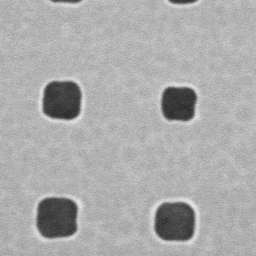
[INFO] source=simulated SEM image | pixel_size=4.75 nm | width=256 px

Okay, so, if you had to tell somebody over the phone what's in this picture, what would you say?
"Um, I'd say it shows holes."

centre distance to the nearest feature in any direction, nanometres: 556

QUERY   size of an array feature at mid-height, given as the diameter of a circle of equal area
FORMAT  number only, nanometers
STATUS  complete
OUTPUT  205